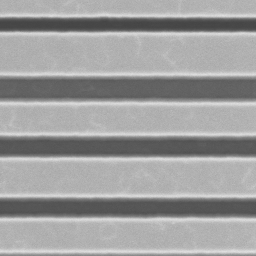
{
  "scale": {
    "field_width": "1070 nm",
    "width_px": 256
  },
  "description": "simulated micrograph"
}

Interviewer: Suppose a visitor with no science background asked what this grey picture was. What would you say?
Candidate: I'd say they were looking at parallel lines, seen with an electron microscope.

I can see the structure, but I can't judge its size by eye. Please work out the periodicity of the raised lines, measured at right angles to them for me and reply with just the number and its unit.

60.6 pixels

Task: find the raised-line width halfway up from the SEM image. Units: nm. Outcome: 170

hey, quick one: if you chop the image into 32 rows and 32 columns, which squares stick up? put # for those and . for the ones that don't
################################
################################
................................
................................
################################
################################
################################
################################
################################
################################
................................
................................
................................
################################
################################
################################
################################
................................
................................
.##....#........................
################################
################################
################################
################################
################################
................................
................................
################################
################################
################################
################################
################################